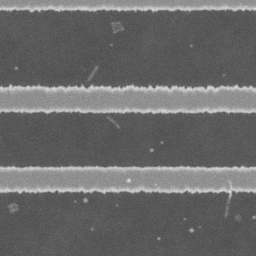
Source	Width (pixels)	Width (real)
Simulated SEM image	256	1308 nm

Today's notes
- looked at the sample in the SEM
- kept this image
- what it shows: lines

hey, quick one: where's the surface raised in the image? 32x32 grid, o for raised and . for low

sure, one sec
oooooooooooooooooooooooooooooooo
................................
................................
................................
................................
................................
................................
................................
................................
................................
................................
oooooooooooooooooooooooooooooooo
oooooooooooooooooooooooooooooooo
oooooooooooooooooooooooooooooooo
................................
................................
................................
................................
................................
................................
................................
oooooooooooooooooooooooooooooooo
oooooooooooooooooooooooooooooooo
oooooooooooooooooooooooooooooooo
................................
................................
................................
................................
................................
................................
................................
................................